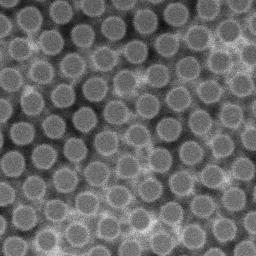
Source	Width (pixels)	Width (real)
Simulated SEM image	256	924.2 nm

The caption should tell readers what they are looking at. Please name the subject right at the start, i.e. a regular array of raised bodies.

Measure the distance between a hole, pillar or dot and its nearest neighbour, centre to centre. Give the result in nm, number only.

114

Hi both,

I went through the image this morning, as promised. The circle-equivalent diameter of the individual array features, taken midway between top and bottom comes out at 81.9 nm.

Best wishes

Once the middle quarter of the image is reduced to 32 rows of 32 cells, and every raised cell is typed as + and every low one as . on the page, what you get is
+++++...++++..........+++...++++
+++++....++..........+++++..++++
.+++.........++++....+++++...+++
.............+++++...+++++....++
......++++...+++++...+++++......
+....++++++..+++++....+++.......
++...++++++...+++..........+++..
++...+++++.......++.......+++++.
++....++++......++.++++...+++++.
++..........++....+++++...+++++.
+..........++++...++++++..+++++.
....+++...++++++..+++++.........
...+++++..++++++...++++.........
..++++++...+++++...............+
..++++++...++++.........++++...+
...++++..........+++...++++++..+
....++..........+++++..++++++...
.........+++....+++++...+++++...
........+++++...+++++....+++....
.++++...+++++...+++++...........
+++++...+++++.....++..........++
+++++...+++++.........+++....+++
++++++...............+++++...+++
.++++.........++++...++++++..+++
..............++++...++++++...++
......++++...++++++...+++++.....
+....++++++..++++++....++.......
+++..++++++...++++..........+++.
+++...+++++................+++++
+++...++++..........+++....+++++
+++................+++++...+++++
++..........++++...+++++...+++++